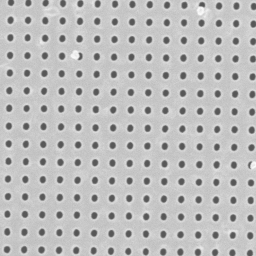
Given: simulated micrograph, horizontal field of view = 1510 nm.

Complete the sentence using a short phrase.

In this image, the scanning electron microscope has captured a regular array of holes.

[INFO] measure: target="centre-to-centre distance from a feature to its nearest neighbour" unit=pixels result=17.2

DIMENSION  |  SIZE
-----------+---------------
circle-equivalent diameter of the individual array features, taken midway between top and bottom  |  39.4 nanometres